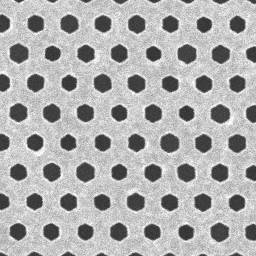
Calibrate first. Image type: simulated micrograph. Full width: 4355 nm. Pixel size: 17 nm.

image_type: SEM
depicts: a regular array of holes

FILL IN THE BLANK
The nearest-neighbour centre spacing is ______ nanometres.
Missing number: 569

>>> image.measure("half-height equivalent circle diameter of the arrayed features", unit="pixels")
17.9